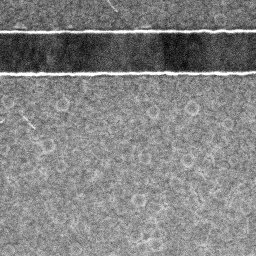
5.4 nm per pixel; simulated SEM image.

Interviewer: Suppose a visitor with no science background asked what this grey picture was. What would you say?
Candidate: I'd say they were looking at one or a few lines or trenches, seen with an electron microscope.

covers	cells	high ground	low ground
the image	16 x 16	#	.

................
................
################
################
################
................
................
................
................
................
................
................
................
................
................
................